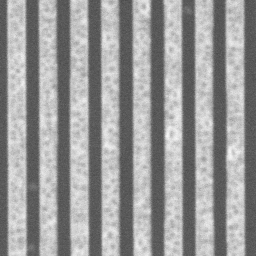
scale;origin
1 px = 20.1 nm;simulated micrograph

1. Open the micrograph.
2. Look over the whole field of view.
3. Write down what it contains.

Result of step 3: parallel lines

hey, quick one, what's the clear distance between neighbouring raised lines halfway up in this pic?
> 317 nm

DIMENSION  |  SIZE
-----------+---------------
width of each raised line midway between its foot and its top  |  317 nm